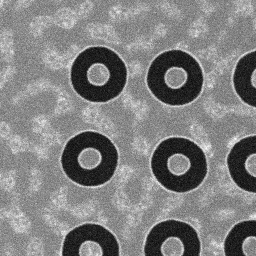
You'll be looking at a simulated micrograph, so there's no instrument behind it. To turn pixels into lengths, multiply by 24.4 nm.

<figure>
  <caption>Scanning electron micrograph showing ring-shaped grooves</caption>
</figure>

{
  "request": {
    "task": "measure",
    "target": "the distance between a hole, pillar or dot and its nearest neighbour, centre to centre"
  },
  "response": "1970 nanometres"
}